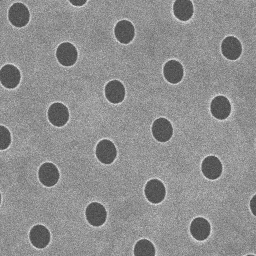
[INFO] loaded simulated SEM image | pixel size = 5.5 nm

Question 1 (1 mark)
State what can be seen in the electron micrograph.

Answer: a regular array of holes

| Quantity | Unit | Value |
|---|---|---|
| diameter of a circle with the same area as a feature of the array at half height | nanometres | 126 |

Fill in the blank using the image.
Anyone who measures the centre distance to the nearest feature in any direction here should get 0.333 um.